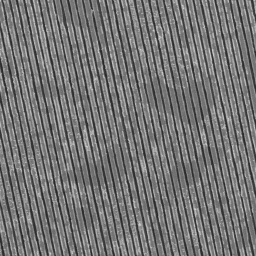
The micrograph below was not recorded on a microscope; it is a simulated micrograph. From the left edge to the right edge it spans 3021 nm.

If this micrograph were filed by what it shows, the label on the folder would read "parallel lines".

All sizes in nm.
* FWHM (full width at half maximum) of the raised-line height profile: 56.4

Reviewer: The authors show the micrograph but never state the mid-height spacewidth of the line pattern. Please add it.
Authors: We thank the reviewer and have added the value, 33.3 nm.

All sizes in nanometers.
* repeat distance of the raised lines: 84.8